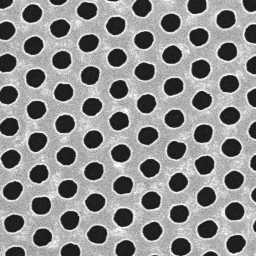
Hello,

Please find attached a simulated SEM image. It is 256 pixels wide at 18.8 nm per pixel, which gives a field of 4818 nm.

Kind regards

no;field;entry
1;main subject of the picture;a regular array of holes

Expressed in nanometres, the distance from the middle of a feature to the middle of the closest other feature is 592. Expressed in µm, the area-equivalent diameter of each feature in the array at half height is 0.359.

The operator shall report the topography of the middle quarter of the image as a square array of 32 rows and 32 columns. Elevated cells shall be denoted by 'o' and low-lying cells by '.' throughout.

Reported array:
.ooooooooooo..oooo....oooooooooo
ooooo....ooooooooo.....ooooooooo
oooo.....ooooooooo.....ooooooooo
oooo.....ooooooooo....ooooo.oooo
ooooo...oooo...oooooooooo.....oo
..oooooooooo....ooooooooo.....oo
..ooooooooo.....ooooooooo.....oo
..oooooooooo....oooooooooo..oooo
..oooo..ooooo..oooo....ooooooooo
ooooo....ooooooooo.....ooooooooo
ooooo.....oooooooo.....ooooooooo
ooooo....oooooooooo...ooooo..ooo
ooooo...oooo....oooooooooo....oo
..oooooooooo....ooooooooo.....oo
...oooooooo.....ooooooooo.....oo
...ooooooooo....oooooooooo...ooo
..ooooooooooo.ooooo....ooooooooo
oooooo...oooooooooo.....oooooooo
ooooo.....oooooooo.....ooooooooo
ooooo.....ooooooooo...ooooo..ooo
ooooo....oooo...oooooooooo....oo
...ooooooooo.....ooooooooo.....o
...ooooooooo.....ooooooooo....oo
...ooooooooo....ooooooooooo..ooo
..ooooo.ooooo..ooooo....oooooooo
oooooo....ooooooooo.....oooooooo
ooooo.....ooooooooo.....oooooooo
ooooo.....oooooooooo...ooooo..oo
oooooo...oooo....oooooooooo....o
...oooooooooo....ooooooooo.....o
...ooooooooo.....ooooooooo.....o
...ooooooooo.....oooooooooo...oo